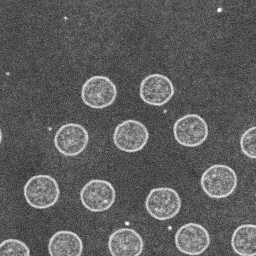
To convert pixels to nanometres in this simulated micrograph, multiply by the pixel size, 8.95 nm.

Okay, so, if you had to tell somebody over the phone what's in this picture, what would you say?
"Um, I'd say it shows a regular array of raised bodies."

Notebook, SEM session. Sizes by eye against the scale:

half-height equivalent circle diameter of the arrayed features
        282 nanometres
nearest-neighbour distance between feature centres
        480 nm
